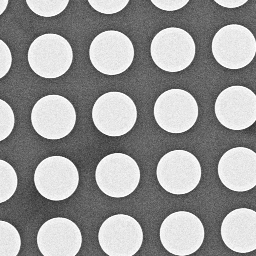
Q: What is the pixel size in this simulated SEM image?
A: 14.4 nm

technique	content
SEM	an array of small figures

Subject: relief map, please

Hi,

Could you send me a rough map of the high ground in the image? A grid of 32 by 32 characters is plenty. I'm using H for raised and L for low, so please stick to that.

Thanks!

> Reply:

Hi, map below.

HLLHHHHHLLLHHHHHLLLHHHHLLLLHHHLL
LLLLHHHHLLLLLHHLLLLLLLLLLLLLLLLL
LLLLLLLLLLLLLLLLLLLLLLLLLLLLLLLL
LLLLLLLLLLLLLLLLLLLLLHLLLLLLHHHL
LLLLLHHLLLLLHHHHLLLHHHHHLLLHHHHH
HLLLHHHHHLLHHHHHLLLHHHHHLLLHHHHH
HLLLHHHHHLLHHHHHHLLHHHHHLLLHHHHH
HLLLHHHHHLLHHHHHHLLHHHHHLLLHHHHL
HLLLHHHHHLLLHHHHLLLLHHHLLLLLLHLL
LLLLLHHLLLLLLLLLLLLLLLLLLLLLLLLL
LLLLLLLLLLLLLLLLLLLLLLLLLLLLLLLL
LLLLLLLLLLLLLLLLLLLLLHHLLLLLHHHH
LLLLLHHHLLLLHHHHLLLLHHHHLLLHHHHH
HLLLHHHHHLLLHHHHHLLHHHHHHLLHHHHH
HHLLHHHHHLLLHHHHHLLHHHHHHLLHHHHH
HHLLHHHHHLLLHHHHHLLLHHHHLLLLHHHH
HLLLLHHHHLLLLHHHLLLLLHHLLLLLLLLL
LLLLLLLLLLLLLLLLLLLLLLLLLLLLLLLL
LLLLLLLLLLLLLLLLLLLLLLLLLLLLLHHL
LLLLLLLLLLLLLHHHLLLLLHHHLLLLHHHH
HLLLLHHHHLLLHHHHHLLLHHHHHLLHHHHH
HHLLHHHHHHLLHHHHHLLLHHHHHLLHHHHH
HHLLHHHHHHLLHHHHHLLLHHHHHLLLHHHH
HHLLLHHHHHLLHHHHHLLLHHHHLLLLLHHL
HLLLLHHHHLLLLLHHLLLLLLLLLLLLLLLL
LLLLLLLLLLLLLLLLLLLLLLLLLLLLLLLL
LLLLLLLLLLLLLLLLLLLLLLHLLLLLLHHH
LLLLLLHHHLLLLHHHHLLLLHHHHLLLHHHH
HHLLLHHHHHLLLHHHHHLLHHHHHLLLHHHH
HHLLLHHHHHLLHHHHHHLLHHHHHLLLHHHH
HHLLLHHHHHLLLHHHHHLLHHHHHLLLHHHH
HHLLLHHHHHLLLHHHHLLLLHHHLLLLLLHL